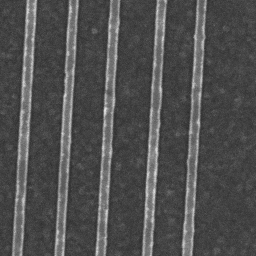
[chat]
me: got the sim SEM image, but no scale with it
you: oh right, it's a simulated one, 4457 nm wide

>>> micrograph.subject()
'parallel lines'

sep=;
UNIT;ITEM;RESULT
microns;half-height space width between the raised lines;0.582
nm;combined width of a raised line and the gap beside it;739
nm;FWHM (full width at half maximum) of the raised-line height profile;137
